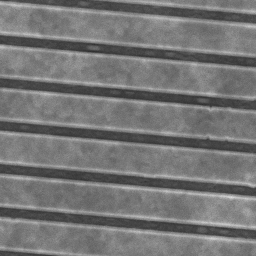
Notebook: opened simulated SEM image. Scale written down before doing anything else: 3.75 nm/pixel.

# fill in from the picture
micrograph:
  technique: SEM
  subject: parallel lines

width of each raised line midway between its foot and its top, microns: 0.115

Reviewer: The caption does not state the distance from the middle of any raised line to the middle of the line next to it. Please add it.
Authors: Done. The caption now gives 161 nm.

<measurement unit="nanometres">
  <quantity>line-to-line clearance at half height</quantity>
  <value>45.2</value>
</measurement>